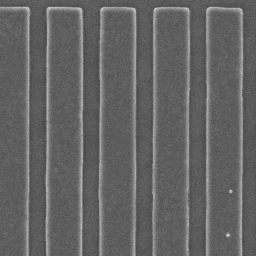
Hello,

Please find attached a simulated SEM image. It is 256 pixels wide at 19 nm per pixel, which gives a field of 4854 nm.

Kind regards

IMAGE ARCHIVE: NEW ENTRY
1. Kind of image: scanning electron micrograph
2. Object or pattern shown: wiring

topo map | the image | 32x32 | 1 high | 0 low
00000000000000000000000000000000
11110011110001111001111100111100
11110011110001111001111100111100
11110011110001111001111100111100
11110011110001111001111100111100
11110011110001111001111100111100
11110011110001111001111100111100
11110011110001111001111100111100
11110011110001111001111100111100
11110011110001111001111100111100
11110011110001111001111100111100
11110011110001111001111100111100
11110011110001111001111100111100
11110011110001111001111100111100
11110011110001111001111100111100
11110011110001111001111100111100
11110011110001111001111100111100
11110011110001111001111100111100
11110011110001111001111100111100
11110011110001111001111100111100
11110011110001111001111100111100
11110011110001111001111100111100
11110011110011111001111100111100
11110011110011111001111100111100
11110011110011111001111000111100
11110011110001111001111000111100
11100011110001111001111100111100
11100011110001111001111100111100
11100011110001111001111100111100
11100011110001111001111100111100
11100011110001111001111000111100
11100011110001111001111100111100